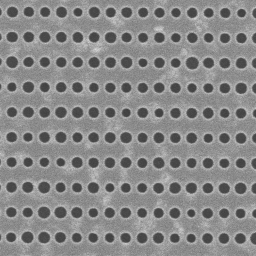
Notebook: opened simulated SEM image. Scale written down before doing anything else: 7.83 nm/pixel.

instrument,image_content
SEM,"a regular array of holes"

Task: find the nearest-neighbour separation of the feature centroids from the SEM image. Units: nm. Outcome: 127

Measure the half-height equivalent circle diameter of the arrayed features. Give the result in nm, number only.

80.8